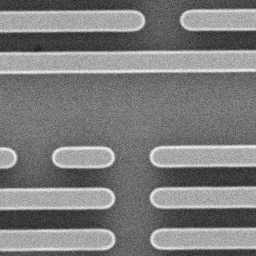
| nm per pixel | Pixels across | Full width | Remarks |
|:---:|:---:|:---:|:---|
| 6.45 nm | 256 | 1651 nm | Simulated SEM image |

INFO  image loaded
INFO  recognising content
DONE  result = groups of lines, slits or small figures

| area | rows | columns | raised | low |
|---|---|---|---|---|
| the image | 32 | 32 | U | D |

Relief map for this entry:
DDDDDDDDDDDDDDDDDDDDDDDDDDDDDDDD
DDDUUUUUUUUUUUUUUDDDDDDUUUUUUUUU
UUUUUUUUUUUUUUUUUUDDDDDUUUUUUUUU
UUUUUUUUUUUUUUUUUUDDDDDUUUUUUUUU
DDDDDDDDDDDDDDDDDDDDDDDDDDDDDDDD
DDDDDDDDDDDDDDDDDDDDDDDDDDDDDDDD
DDDDDDDDDDDDDDDDDDDDDDUUUUUUUUUU
UUUUUUUUUUUUUUUUUUUUUUUUUUUUUUUU
UUUUUUUUUUUUUUUUUUUUUUUUUUUUUUUU
DDDDDDDDDDDDDDDDDDDDDDDDDDDDDDDD
DDDDDDDDDDDDDDDDDDDDDDDDDDDDDDDD
DDDDDDDDDDDDDDDDDDDDDDDDDDDDDDDD
DDDDDDDDDDDDDDDDDDDDDDDDDDDDDDDD
DDDDDDDDDDDDDDDDDDDDDDDDDDDDDDDD
DDDDDDDDDDDDDDDDDDDDDDDDDDDDDDDD
DDDDDDDDDDDDDDDDDDDDDDDDDDDDDDDD
DDDDDDDDDDDDDDDDDDDDDDDDDDDDDDDD
DDDDDDDDDDDDDDDDDDDDDDDDDDDDDDDD
DDDDDDDDDUUUUDDDDDDDUUUUUUUUUUUU
UUDDDDDUUUUUUUDDDDDUUUUUUUUUUUUU
UUDDDDDUUUUUUUDDDDDUUUUUUUUUUUUU
DDDDDDDDDDDDDDDDDDDDDDDDDDDDDDDD
DDDDDDDDDDDDDDDDDDDDDDDDDDDDDDDD
DDDDDDDDDDDDDDDDDDDDDDDDDDDDDUUU
UUUUUUUUUUUUUUDDDDDUUUUUUUUUUUUU
UUUUUUUUUUUUUUDDDDDUUUUUUUUUUUUU
DDDDDDDDDDDDDDDDDDDDDDDDDDDDDDDD
DDDDDDDDDDDDDDDDDDDDDDDDDDDDDDDD
DDDDDDDDDDDDDDDDDDDDDDDDDDDDDDDD
UUUUUUUUUUUUUUDDDDDUUUUUUUUUUUUU
UUUUUUUUUUUUUUDDDDDUUUUUUUUUUUUU
DDDDDDDDDDDDDDDDDDDDDDDDDDDDDDDD